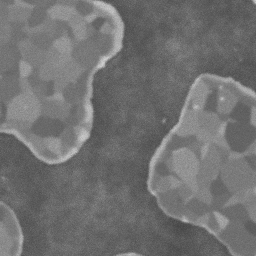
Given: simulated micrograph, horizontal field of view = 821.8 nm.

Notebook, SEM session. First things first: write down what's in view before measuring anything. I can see raised bodies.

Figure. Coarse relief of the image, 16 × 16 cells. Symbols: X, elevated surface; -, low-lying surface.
XXXXXXX---------
XXXXXXX---------
XXXXXXX---------
XXXXXXX---------
XXXXXX----------
XXXXXX------XXX-
XXXXXX------XXXX
XXXXXX-----XXXXX
-XXXX------XXXXX
--XXX-----XXXXXX
---------XXXXXXX
---------XXXXXXX
----------XXXXXX
X----------XXXXX
X------------XXX
X-------------XX